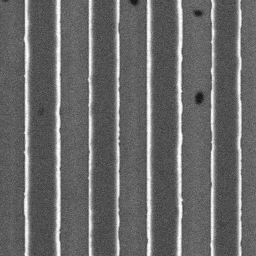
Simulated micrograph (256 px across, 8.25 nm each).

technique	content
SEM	lines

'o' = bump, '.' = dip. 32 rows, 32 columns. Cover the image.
...oooo....oooo...ooooo...oooo..
...oooo....oooo...ooooo...oooo..
...oooo....oooo...ooooo...oooo..
...oooo....oooo...ooooo....ooo..
...oooo....oooo...ooooo....ooo..
...oooo....oooo...ooooo....ooo..
...oooo....oooo...ooooo....ooo..
...oooo....oooo...ooooo....ooo..
...oooo....oooo...ooooo...oooo..
...oooo....oooo...ooooo...oooo..
...oooo....oooo...ooooo....ooo..
...oooo....oooo...ooooo...oooo..
...oooo....oooo...ooooo...oooo..
...oooo....oooo...ooooo...oooo..
...oooo....oooo....oooo...oooo..
...oooo....oooo...ooooo...oooo..
...oooo....oooo...ooooo...oooo..
...oooo....oooo....oooo....ooo..
...oooo....oooo...ooooo...oooo..
...oooo....oooo...ooooo...oooo..
...oooo....oooo...ooooo...oooo..
...oooo....oooo...ooooo...oooo..
...oooo....oooo....oooo...oooo..
...oooo....oooo...ooooo...oooo..
...oooo....oooo...ooooo...oooo..
...oooo....oooo...ooooo...oooo..
...oooo....oooo....oooo...oooo..
...oooo....oooo...ooooo...oooo..
...oooo....oooo...ooooo...oooo..
...oooo....oooo....oooo...oooo..
...oooo....oooo...ooooo...oooo..
...oooo....oooo...oooo....oooo..